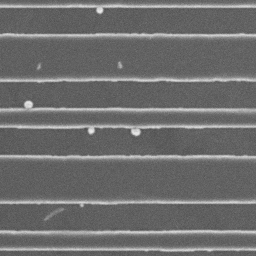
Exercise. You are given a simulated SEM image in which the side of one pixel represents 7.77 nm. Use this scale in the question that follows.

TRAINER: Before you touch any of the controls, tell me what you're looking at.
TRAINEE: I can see lines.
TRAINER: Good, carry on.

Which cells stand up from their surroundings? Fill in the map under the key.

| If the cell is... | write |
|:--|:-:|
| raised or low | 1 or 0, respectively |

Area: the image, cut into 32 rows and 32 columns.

11111111111111111111111111111111
00000000000000000000000000000000
00000000000000000000000000000000
00000000000000000000000000000000
11111111111111111111111111111111
11111111111111111111111111111111
11111111111111111111111111111111
11111111111111111111111111111111
11111111111111111111111111111111
11111111111111111111111111111111
00000000000000000000000000000000
00000000000000000000000000000000
00000000000000000000000000000000
00010000000000000000000000000000
11111111111111111111111111111111
11111111111111111111111111111111
00000000000000000000000000000000
00000000000000000000000000000000
00000000000000000000000000000000
11111110110000111111111011111000
11111111111111111111111111111111
11111111111111111111111111111111
11111111111111111111111111111111
11111111111111111111111111111111
11111111111111111111111111111111
00000000000000000000000000000000
00000000000000000000000000000000
00000000000000000000000000000000
00000000000000000000000000000000
11111111111111111111111111111111
11111111111111111111111111111111
00000000000000000000000000000000